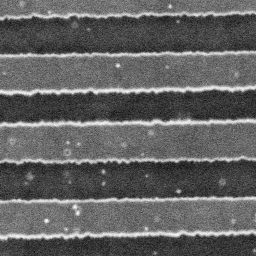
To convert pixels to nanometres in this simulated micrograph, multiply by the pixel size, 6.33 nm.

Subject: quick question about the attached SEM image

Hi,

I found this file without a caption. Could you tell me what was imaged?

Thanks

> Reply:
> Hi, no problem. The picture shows lines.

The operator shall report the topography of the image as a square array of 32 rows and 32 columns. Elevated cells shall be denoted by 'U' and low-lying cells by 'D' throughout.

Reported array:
UUUUUUUUUUUUUUUUUUUUUUUUUUUUUUUU
UUUUUUUUUUUUUUUUUUUUUUUUUUUUUUUU
DDDDDDDDDDDDDDDDDDDDDDDDDDDDDDDD
DDDDDDDDDDDDDDDDDDDDDDDDDDDDDDDD
DDDDDDDDDDDDDDDDDDDDDDDDDDDDDDDD
DDDDDDDDDDDDDDDDDDDDDDDDDDDDDDDD
DDDDDDDDDDDDDDDDDDDDDDDDDDDDUDUU
UUUUUUUUUUUUUUUUUUUUUUUUUUUUUUUU
UUUUUUUUUUUUUUUUUUUUUUUUUUUUUUUU
UUUUUUUUUUUUUUUUUUUUUUUUUUUUUUUU
UUUUUUUUUUUUUUUUUUUUUUUUUUUUUUUU
UUUUDDDDDDDDDDDDDDDDDDDDDDDDDDDD
DDDDDDDDDDDDDDDDDDDDDDDDDDDDDDDD
DDDDDDDDDDDDDDDDDDDDDDDDDDDDDDDD
DDDDDDDDDDDDDDDDDDDDDDDDDDDDDDDD
DDDDDUDDUDDUUUUUUUUUUUUUUUUUUUUU
UUUUUUUUUUUUUUUUUUUUUUUUUUUUUUUU
UUUUUUUUUUUUUUUUUUUUUUUUUUUUUUUU
UUUUUUUUUUUUUUUUUUUUUUUUUUUUUUUU
UUUUUUUUUUUUUUUUUUUUUUUUUUUUUUUU
DDDDDDDDDDDDDDDDDDDDDDDDDDDDDDDD
DDDDDDDDDDDDDDDDDDDDDDDDDDDDDDDD
DDDDDDDDDDDDDDDDDDDDDDDDDDDDDDDD
DDDDDDDDDDDDDDDDDDDDDDDDDDDDDDDD
DDDDDDDDDDDDDDDDDDDDDDDDDDDDDDDD
UUUUUUUUUUUUUUUUUUUUUUUUUUUUUUUU
UUUUUUUUUUUUUUUUUUUUUUUUUUUUUUUU
UUUUUUUUUUUUUUUUUUUUUUUUUUUUUUUU
UUUUUUUUUUUUUUUUUUUUUUUUUUUUUUUU
UUUUUUUUUDDDDDDDDDDDDDDDDDDDDDDD
DDDDDDDDDDDDDDDDDDDDDDDDDDDDDDDD
DDDDDDDDDDDDDDDDDDDDDDDDDDDDDDDD